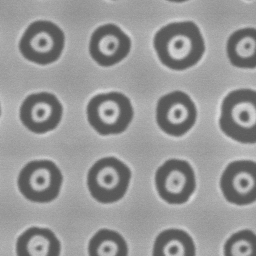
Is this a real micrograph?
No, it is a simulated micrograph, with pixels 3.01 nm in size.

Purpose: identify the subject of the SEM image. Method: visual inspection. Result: a regular array of ring-shaped grooves with a dot in the middle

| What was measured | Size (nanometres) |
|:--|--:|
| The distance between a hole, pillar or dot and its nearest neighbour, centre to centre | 202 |